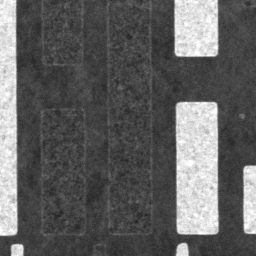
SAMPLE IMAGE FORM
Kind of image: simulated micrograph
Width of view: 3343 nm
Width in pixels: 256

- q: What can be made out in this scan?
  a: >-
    wiring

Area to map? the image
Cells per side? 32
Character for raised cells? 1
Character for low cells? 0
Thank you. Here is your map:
11000111110000111110001111100001
11000111110000111110001111100000
11000111110000111110001111100000
11000111110000111110001111100000
11000111110000111110001111100000
11000111110000111110001111100000
11000111110000111110001111100000
11000111110000111110000000000000
11000000000000111110000000000000
11000000000000111110000000000000
11000000000000111110000000000000
11000000000000111110000000000000
11000000000000111110000000000000
11000000000000111110001111100000
11000111111000111110001111100000
11000111111000111110001111100000
11000111111000111110001111100000
11000111111000111110001111100000
11000111111000111110001111100000
11000111111000111110001111100000
11000111111000111110001111100000
11000111111000111110001111100001
11000111111000111110001111100001
11000111111000111110001111100001
11000111111000111110001111100001
11000111111000111110001111100001
11000111111000111110001111100001
11000111111000111110001111100001
11000111111000111110001111100001
00000000000000000000000000000000
00000000000000000000000000000000
01100000000010000000001000000000